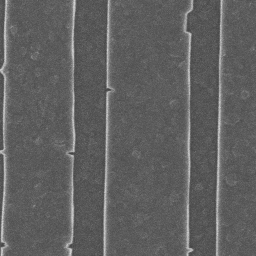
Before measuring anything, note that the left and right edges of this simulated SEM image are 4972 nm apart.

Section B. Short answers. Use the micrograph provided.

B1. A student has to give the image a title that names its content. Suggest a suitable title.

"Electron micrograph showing one or a few lines or trenches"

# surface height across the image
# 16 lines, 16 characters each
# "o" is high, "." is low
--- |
ooooo..ooooo..oo
ooooo..ooooo..oo
ooooo..ooooo..oo
ooooo..ooooo..oo
ooooo..ooooo..oo
ooooo..ooooo..oo
ooooo..ooooo..oo
ooooo..ooooo..oo
ooooo..ooooo..oo
ooooo..ooooo..oo
ooooo..ooooo..oo
ooooo..ooooo..oo
ooooo..ooooo..oo
ooooo..ooooo..oo
oooo...ooooo..oo
oooo...ooooo..oo